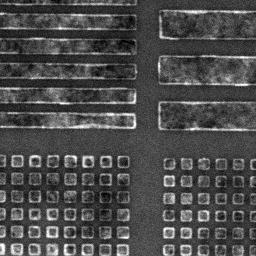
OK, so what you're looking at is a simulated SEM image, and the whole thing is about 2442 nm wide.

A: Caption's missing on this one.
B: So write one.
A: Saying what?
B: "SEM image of groups of lines, slits or small figures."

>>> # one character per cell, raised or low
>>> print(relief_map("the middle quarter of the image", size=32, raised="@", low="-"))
@@@@@@@@@@@@@@@@@@------@@@@@@@@
@@@@@@@@@@@@@@@@@@------@@@@@@@@
@@@@@@@@@@@@@@@@@@------@@@@@@@@
----------@@@@@@@@------@@@@@@@@
------------------------@@@@@@@@
--------------------------------
@@@@@@@@@@@@@@@@@@--------------
@@@@@@@@@@@@@@@@@@--------------
@@@@@@@@@@@@@@@@@@--------------
@@@@@@@@@@@@@@@@@---------------
------------------------@@@@@@@@
------------------------@@@@@@@@
@@@---------------------@@@@@@@@
@@@@@@@@@@@@@@@@@@------@@@@@@@@
@@@@@@@@@@@@@@@@@@------@@@@@@@@
@@@@------@@@@@@@@------@@@@@@@@
--------------------------------
--------------------------------
--------------------------------
--------------------------------
--------------------------------
--------------------------------
--------------------------------
@@@--@@---@@--@@----------------
@@@--@@--@@@--@@---------@@@-@@@
-@@--@@---@---@@---------@@@-@@@
--------------------------------
--------------------------------
@@@--@@--@@@--@@---------@@--@@@
@@@--@@--@@@--@@---------@@--@@@
------------------------------@@
--------------------------------